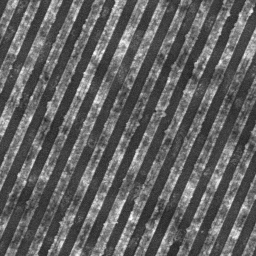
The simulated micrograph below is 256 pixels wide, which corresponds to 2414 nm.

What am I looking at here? parallel lines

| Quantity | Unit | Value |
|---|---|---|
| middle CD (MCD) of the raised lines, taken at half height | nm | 79.9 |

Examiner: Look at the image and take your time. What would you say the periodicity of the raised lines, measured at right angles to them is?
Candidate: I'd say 186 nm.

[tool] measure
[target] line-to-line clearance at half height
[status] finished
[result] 104 nm